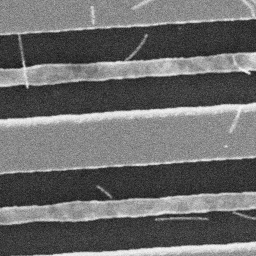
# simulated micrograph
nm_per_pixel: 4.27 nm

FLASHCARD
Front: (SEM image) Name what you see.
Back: lines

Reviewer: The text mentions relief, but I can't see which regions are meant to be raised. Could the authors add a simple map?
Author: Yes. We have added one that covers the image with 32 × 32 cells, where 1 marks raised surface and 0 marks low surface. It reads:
11111111111111111111111111111111
11111111111111111111111111111111
11111111111111111111111111111100
11111111111100000000000000000000
00000000000000000000000000000000
00000000000000000000000000000000
00000000000000000000000000000000
00000000000000000001111111111111
00011111111111111111111111111111
11111111111111111100000000000000
11111110000000000000000000000000
00000000000000000000000000000000
00000000000000000000000000000000
00000000000000000000000000111111
00000000001111111111111111111111
11111111111111111111111111111111
11111111111111111111111111111111
11111111111111111111111111111111
11111111111111111111111111111111
11111111111111111111111111111111
11111111111111111111000000000000
11000000000000000000000000000000
00000000000000000000000000000000
00000000000000000000000000000000
00000000000000000000000011111111
00000001111111111111111111111111
11111111111111111111111111000000
11111111111000000000000000000000
00000000000000000000000000000000
00000000000000000000000000000000
00000000000000000000000000000000
00000000000000011111111111111111